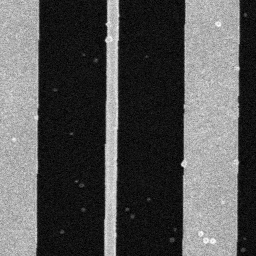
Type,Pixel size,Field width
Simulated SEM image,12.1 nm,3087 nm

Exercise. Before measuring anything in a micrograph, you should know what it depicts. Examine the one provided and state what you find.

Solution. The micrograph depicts lines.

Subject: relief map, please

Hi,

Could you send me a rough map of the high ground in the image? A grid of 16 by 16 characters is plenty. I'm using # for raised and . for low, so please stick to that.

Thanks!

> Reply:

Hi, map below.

##..........###.
##..........###.
##..........###.
##..........###.
##..........###.
##..........###.
##..........###.
##..........###.
##..........###.
##..........###.
##.........####.
##.........####.
##.........####.
##.........####.
##.........####.
##.........####.